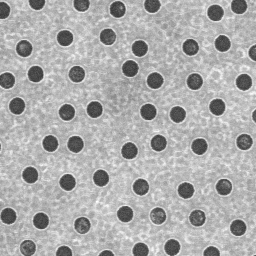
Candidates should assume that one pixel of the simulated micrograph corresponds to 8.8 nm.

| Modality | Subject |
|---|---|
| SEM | a regular array of holes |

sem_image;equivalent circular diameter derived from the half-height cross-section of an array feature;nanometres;151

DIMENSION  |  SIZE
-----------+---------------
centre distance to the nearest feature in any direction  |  0.28 micrometres